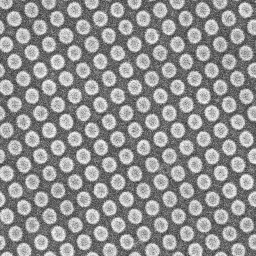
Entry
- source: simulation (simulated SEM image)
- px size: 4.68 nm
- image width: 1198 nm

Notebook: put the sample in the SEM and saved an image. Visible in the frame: a regular array of raised bodies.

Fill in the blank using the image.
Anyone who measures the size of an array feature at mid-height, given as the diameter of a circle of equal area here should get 64.8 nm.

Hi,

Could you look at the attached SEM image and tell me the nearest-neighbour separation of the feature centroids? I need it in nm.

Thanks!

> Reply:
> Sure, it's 88.7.